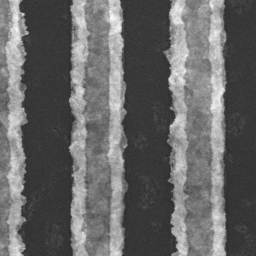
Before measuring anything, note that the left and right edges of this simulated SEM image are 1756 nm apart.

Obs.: one or a few lines or trenches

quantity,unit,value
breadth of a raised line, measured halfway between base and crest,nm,250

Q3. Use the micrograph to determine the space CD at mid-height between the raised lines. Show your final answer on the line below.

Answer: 442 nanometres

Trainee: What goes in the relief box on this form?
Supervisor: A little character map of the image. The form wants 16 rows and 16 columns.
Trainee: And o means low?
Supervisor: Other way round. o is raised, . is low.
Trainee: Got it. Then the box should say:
o....oo....ooo..
o....oo....ooo..
o....oo....oo...
o....oo....ooo..
o....oo....ooo..
o....oo....ooo..
o....oo....ooo..
o....oo....ooo..
o....oo....ooo..
o....oo....ooo..
o....oo....ooo..
o....oo....ooo..
o....oo....ooo..
o....oo....ooo..
o....oo....ooo..
o....oo....ooo..